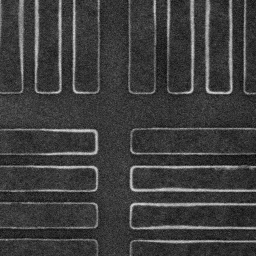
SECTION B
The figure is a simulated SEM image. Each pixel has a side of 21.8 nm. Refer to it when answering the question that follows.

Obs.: groups of lines, slits or small figures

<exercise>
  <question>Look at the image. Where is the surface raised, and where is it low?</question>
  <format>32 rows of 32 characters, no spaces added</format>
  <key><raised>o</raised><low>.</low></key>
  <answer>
ooo..oo..ooo....ooo..ooo..ooo..o
ooo..oo..ooo....ooo..ooo..ooo..o
oo...oo..ooo....ooo..ooo..ooo..o
ooo..oo..ooo....ooo..ooo..ooo..o
ooo..oo..ooo....ooo..ooo..ooo..o
ooo..oo..ooo....ooo..ooo..ooo..o
ooo..oo..ooo....ooo..ooo..ooo..o
ooo..oo..ooo....ooo..ooo..ooo..o
ooo..oo..ooo....ooo..ooo..ooo..o
ooo..oo..ooo....ooo..ooo..ooo..o
ooo.ooo..ooo....ooo..ooo..ooo..o
oo...oo...oo....ooo..ooo..ooo..o
................................
................................
................................
................................
oooooooooooo.....ooooooooooooooo
oooooooooooo....oooooooooooooooo
oooooooooooo....oooooooooooooooo
................................
................................
oooooooooooo....oooooooooooooooo
oooooooooooo....oooooooooooooooo
oooooooooooo.....ooooooooooooooo
................................
oooooooooooo....................
oooooooooooo....oooooooooooooooo
oooooooooooo....oooooooooooooooo
.................o..............
................................
oooooooooooo....oooooooooooooooo
oooooooooooo....oooooooooooooooo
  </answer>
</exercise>